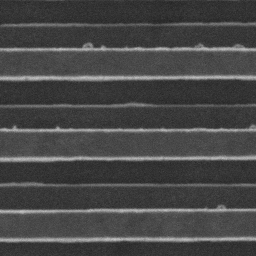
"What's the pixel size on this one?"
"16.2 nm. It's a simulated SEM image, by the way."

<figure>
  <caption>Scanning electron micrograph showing lines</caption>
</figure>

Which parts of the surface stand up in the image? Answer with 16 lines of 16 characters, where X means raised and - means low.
----------------
----------------
----------------
XXXXXXXXXXXXXXXX
XXXXXXXXXXXXXXXX
----------------
----------------
----------------
XXXXXXXXXXXXXXXX
XXXXXXXXXXXXXXXX
----------------
----------------
----------------
XXXXXXXXXXXXXXXX
XXXXXXXXXXXXXXXX
----------------